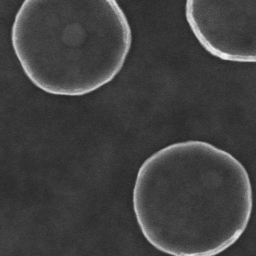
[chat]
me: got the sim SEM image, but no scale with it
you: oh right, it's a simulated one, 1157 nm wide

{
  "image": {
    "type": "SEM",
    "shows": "raised bodies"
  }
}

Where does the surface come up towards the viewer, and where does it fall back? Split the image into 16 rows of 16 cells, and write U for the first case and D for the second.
DUUUUUUDDDDDUUUU
DUUUUUUUDDDDUUUU
DUUUUUUUDDDDUUUU
DUUUUUUUDDDDDDUU
DDUUUUUDDDDDDDDD
DDDUUUDDDDDDDDDD
DDDDDDDDDDDDDDDD
DDDDDDDDDDDDDDDD
DDDDDDDDDDDDDDDD
DDDDDDDDDDUUUUDD
DDDDDDDDDUUUUUUD
DDDDDDDDUUUUUUUU
DDDDDDDDUUUUUUUU
DDDDDDDDDUUUUUUU
DDDDDDDDDUUUUUUD
DDDDDDDDDDUUUUDD